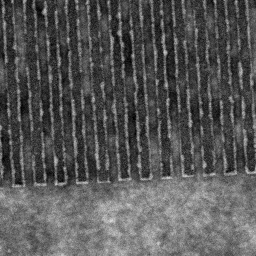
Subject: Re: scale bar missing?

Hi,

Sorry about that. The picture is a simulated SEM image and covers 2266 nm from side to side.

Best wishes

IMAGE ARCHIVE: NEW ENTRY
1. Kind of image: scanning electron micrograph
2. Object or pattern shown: parallel lines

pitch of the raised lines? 188 nm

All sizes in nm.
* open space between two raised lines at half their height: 83.9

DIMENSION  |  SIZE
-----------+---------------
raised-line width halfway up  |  0.105 micrometres